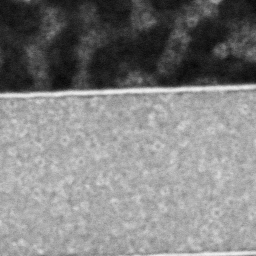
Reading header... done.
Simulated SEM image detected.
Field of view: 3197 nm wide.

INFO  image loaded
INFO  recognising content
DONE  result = one or a few lines or trenches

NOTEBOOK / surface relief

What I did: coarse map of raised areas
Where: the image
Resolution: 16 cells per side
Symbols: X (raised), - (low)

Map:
XXXXXXXXXXXXXXXX
XXXXXXXXXXXXXXXX
XXXXXXXXXXXXXXXX
XXXXXXXXXXXXXXXX
XXXXXXXXXXXXXXXX
XXXXXXXXXXXXX---
----------------
----------------
----------------
----------------
----------------
----------------
----------------
----------------
----------------
----------------